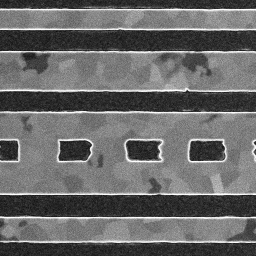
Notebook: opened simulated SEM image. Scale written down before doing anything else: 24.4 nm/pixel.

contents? parallel lines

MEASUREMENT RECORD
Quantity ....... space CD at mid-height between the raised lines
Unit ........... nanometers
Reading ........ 519